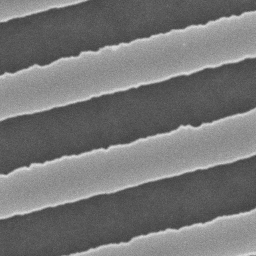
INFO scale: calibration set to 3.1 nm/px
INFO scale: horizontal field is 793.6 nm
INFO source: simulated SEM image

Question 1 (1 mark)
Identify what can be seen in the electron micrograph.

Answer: lines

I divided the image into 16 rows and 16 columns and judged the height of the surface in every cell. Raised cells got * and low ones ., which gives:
***.............
.............***
.........*******
.....***********
.***********....
********........
****............
..............**
..........******
......**********
.************...
*********.......
*****...........
*.............**
..........******
......**********